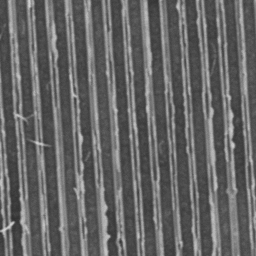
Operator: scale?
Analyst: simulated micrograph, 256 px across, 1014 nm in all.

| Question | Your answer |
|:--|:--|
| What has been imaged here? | parallel lines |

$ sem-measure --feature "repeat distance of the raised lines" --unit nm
74.9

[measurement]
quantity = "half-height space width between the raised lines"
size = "47.5 nm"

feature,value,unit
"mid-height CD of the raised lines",29.2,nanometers